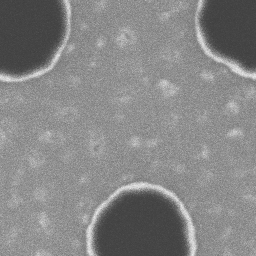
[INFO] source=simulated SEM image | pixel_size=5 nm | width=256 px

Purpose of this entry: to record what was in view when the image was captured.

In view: raised bodies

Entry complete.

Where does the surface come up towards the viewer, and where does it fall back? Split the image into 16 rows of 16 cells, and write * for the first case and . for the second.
****........****
****........****
****.........***
****.........***
***............*
................
................
................
................
................
................
................
.......****.....
......******....
......******....
......******....